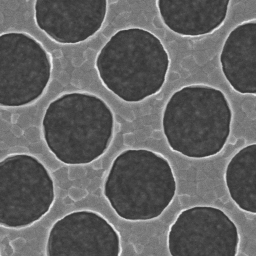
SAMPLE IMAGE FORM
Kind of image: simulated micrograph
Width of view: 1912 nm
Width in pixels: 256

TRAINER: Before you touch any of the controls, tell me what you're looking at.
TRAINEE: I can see holes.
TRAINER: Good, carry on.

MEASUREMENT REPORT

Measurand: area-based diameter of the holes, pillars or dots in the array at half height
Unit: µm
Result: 0.527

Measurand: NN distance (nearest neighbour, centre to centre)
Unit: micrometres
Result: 0.629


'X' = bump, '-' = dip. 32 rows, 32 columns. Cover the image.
XXXXX--------XXXXXXX---------XXX
XXXX---------XXXXXXX--------XXXX
XXXXX--------XXXXXXX--------XXXX
XXXXX-------XXXXXXXXX------XX---
---XXX-----XXX-----XXXXXXXXXX---
-----XXXXXXXX-------XXXXXXXX----
------XXXXXXX--------XXXXXXX----
------XXXXXX---------XXXXXXX----
------XXXXXX---------XXXXXXX----
------XXXXXXX--------XXXXXXX----
------XXXXXXX-------XXXXXXXXX---
-----XXXXXXXXX------XX------XX--
----XXX------XXX--XXX-------XXXX
XXXXXX--------XXXXXXX--------XXX
XXXXXX--------XXXXXXX--------XXX
XXXXX---------XXXXXX---------XXX
XXXXXX--------XXXXXXX--------XXX
XXXXXX--------XXXXXXX-------XXXX
XXXXXX-------XXXXXXXXX------XXX-
XX--XXX-----XXX-----XXX---XXX---
-----XXXXXXXXX-------XXXXXXXX---
------XXXXXXXX-------XXXXXXX----
------XXXXXXX---------XXXXXX----
-------XXXXXX---------XXXXXXX---
-------XXXXXX---------XXXXXXX---
------XXXXXXXX-------XXXXXXXXX--
------XXXX-XXXX-----XXX-----XXXX
-----XXX-----XXXXXXXXX-------XXX
XXXXXXX-------XXXXXXX---------XX
XXXXXX---------XXXXXX---------XX
XXXXXX---------XXXXXX---------XX
XXXXXX---------XXXXXX--------XXX